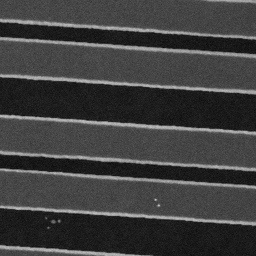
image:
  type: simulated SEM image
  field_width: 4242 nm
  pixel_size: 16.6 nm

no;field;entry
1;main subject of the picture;lines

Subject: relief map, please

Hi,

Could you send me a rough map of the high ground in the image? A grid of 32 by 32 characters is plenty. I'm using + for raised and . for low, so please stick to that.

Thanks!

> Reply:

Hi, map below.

++++++++++++++++++++++++++++++++
++++++++++++++++++++++++++++++++
++++++++++++++++++++++++++++++++
............++++++++++++++++++++
...........................+++++
+++++++++++.....................
+++++++++++++++++++++++++.......
++++++++++++++++++++++++++++++++
++++++++++++++++++++++++++++++++
++++++++++++++++++++++++++++++++
...............+++++++++++++++++
..............................++
................................
................................
................................
+++++++++++++++.................
++++++++++++++++++++++++++++++..
++++++++++++++++++++++++++++++++
++++++++++++++++++++++++++++++++
......++++++++++++++++++++++++++
.....................+++++++++++
++++++..........................
+++++++++++++++++++.............
++++++++++++++++++++++++++++++++
++++++++++++++++++++++++++++++++
++++++++++++++++++++++++++++++++
..........++++++++++++++++++++++
........................++++++++
................................
................................
................................
++++++++++......................